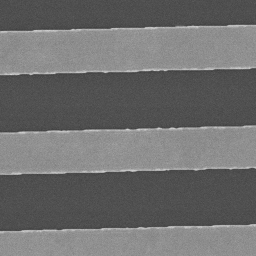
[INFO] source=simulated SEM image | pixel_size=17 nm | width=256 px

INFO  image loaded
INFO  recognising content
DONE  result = lines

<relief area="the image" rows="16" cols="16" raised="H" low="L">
LLLLLLLLLLLLLLLL
LLLLLLLLLLLLLLLL
HHHHHHHHHHHHHHHH
HHHHHHHHHHHHHHHH
HHHHHHHLLLLLLLLL
LLLLLLLLLLLLLLLL
LLLLLLLLLLLLLLLL
LLLLLLLLLLLLLLLL
HHHHHHHHHHHHHHHH
HHHHHHHHHHHHHHHH
HHHHHHHHHHHHHHHH
LLLLLLLLLLLLLLLL
LLLLLLLLLLLLLLLL
LLLLLLLLLLLLLLLL
HHHHHHHHHHHHHHHH
HHHHHHHHHHHHHHHH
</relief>